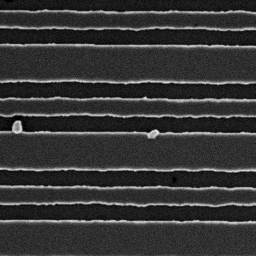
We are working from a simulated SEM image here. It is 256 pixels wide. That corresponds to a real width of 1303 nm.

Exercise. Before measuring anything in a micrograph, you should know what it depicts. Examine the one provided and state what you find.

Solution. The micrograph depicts lines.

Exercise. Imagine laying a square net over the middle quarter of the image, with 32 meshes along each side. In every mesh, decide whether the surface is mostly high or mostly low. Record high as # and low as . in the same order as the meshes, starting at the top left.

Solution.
################################
################################
################################
################################
...........########.....##.#####
................................
................................
................................
....................#...........
################################
################################
################################
################################
................................
................................
................................
................................
################################
################################
################################
################################
################################
################################
################################
################################
################################
........###......#....######..##
................................
................................
................................
................................
################################